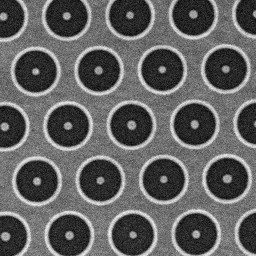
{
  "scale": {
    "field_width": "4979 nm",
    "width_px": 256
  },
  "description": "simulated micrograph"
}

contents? an array of small figures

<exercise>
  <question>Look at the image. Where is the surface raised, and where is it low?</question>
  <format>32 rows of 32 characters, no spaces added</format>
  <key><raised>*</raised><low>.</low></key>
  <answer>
...***.....***.....***.....***..
...***.....**......**......**...
...***.....***.....**......**...
...***.....***.....***....****..
..*****...*****..******..*******
********************************
***...*****...*****...****....**
**.....***.....***.....***.....*
**.....***.....***.....**......*
**.....***.....***.....***.....*
**.....***.....***.....***....**
***...******.*******.***********
********************************
..*****...*****...****....****..
...***.....***.....***.....***..
...***.....***..*..**...*..**...
...***.....***.....***.....***..
...***.....***.....***....****..
.*******.***********************
********************************
***...*****...****....****....**
**.....***.....***.....***.....*
**.....***.....***.....***..*..*
**.....***.....***.....***.....*
**.....****....****...*****...**
********************************
************************.******.
...****....***.....***.....***..
...***.....***.....***.....***..
*...**.....***.....***..*..***..
...***.....***.....***.....***..
...****....****...*****...*****.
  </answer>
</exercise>